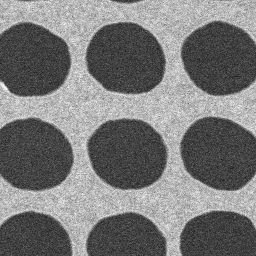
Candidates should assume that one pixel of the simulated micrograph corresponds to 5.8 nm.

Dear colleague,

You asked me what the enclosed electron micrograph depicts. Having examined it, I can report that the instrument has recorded holes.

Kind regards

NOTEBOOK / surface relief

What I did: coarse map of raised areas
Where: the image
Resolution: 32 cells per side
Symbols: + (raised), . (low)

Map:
++++++++++++++++++++++++++++++++
++++++++++++++++++++++++++++++++
++++++++++++++++++++++++++++++++
+.....+++++++.....+++++++.....++
.......+++++.......++++........+
........+++.........+++.........
.........++.........+++.........
.........++..........++.........
.........++..........++.........
........+++..........+++........
........++++........++++........
+......+++++++.....+++++++....++
++++++++++++++++++++++++++++++++
++++++++++++++++++++++++++++++++
++++++++++++++++++++++++++++++++
+.....+++++++......+++++......++
........++++........+++........+
........+++.........+++.........
.........++..........++.........
.........++..........++.........
.........++..........++.........
.........+++........+++.........
+.......+++++.......+++++......+
++.....+++++++....+++++++++...++
++++++++++++++++++++++++++++++++
++++++++++++++++++++++++++++++++
+++.++++++++++++.+++++++++...+++
+......++++++......+++++.......+
........++++........+++.........
.........++.........+++.........
.........++..........+..........
.........++..........++.........